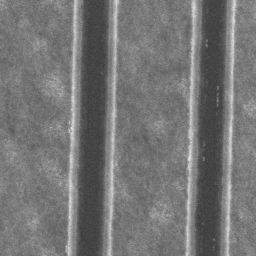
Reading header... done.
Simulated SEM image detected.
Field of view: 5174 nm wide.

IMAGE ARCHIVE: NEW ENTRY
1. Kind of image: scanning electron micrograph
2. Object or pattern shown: one or a few lines or trenches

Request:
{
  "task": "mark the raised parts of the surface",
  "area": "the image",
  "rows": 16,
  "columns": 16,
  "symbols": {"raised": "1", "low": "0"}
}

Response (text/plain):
1111100111110011
1111100111110011
1111100111110011
1111100111110011
1111100111110011
1111100111110011
1111100111110011
1111100111110011
1111100111110011
1111100111110011
1111100111110011
1111100111110011
1111100111110011
1111100111110011
1111100111110011
1111100111110011